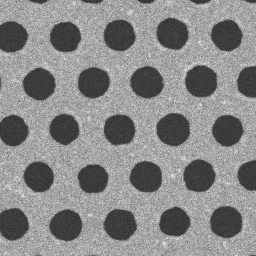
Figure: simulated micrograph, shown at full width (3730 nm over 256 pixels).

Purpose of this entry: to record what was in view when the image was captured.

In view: a regular array of holes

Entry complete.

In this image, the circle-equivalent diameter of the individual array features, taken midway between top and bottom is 0.462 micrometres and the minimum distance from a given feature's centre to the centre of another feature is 0.772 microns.